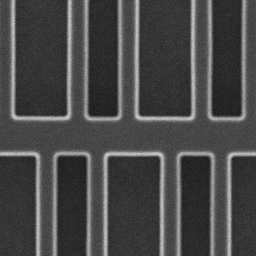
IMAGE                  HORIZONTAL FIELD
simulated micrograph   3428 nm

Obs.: groups of lines, slits or small figures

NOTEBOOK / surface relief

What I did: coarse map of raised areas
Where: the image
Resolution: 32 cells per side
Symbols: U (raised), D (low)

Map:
UUDDDDDDDUUDDDDUUDDDDDDDUUDDDDUU
UUDDDDDDDUUDDDDUUDDDDDDDUUDDDDUU
UUDDDDDDDUUDDDDUUDDDDDDDUUDDDDUU
UUDDDDDDDUUDDDDUUDDDDDDDUUDDDDUU
UUDDDDDDDUUDDDDUUDDDDDDDUUDDDDUU
UUDDDDDDDUUDDDDUUDDDDDDDUUDDDDUU
UUDDDDDDDUUDDDDUUDDDDDDDUUDDDDUU
UUDDDDDDDUUDDDDUUDDDDDDDUUDDDDUU
UUDDDDDDDUUDDDDUUDDDDDDDUUDDDDUU
UUDDDDDDDUUDDDDUUDDDDDDDUUDDDDUU
UUDDDDDDDUUDDDDUUDDDDDDDUUDDDDUU
UUDDDDDDDUUDDDDUUDDDDDDDUUDDDDUU
UUDDDDDDDUUDDDDUUDDDDDDDUUDDDDUU
UUDDDDDDDUUDDDDUUDDDDDDDUUDDDDUU
UUDDDDDDUUUDDDDUUDDDDDDDUUDDDDUU
UUUUUUUUUUUUUUUUUUUUUUUUUUUUUUUU
UUUUUUUUUUUUUUUUUUUUUUUUUUUUUUUU
UUUUUUUUUUUUUUUUUUUUUUUUUUUUUUUU
UUUUUUUUUUUUUUUUUUUUUUUUUUUUUUUU
DDDDUUUDDDDUUUDDDDDDUUUDDDUUUDDD
DDDDDUUDDDDUUDDDDDDDUUDDDDDUUDDD
DDDDDUUDDDDUUDDDDDDDUUDDDDDUUDDD
DDDDDUUDDDDUUDDDDDDDUUDDDDUUUDDD
DDDDDUUDDDDUUDDDDDDDUUDDDDUUUDDD
DDDDDUUDDDDUUDDDDDDDUUDDDDUUUDDD
DDDDDUUDDDDUUDDDDDDDUUDDDDUUUDDD
DDDDDUUDDDDUUDDDDDDDUUDDDDUUUDDD
DDDDDUUDDDDUUDDDDDDDUUDDDDUUUDDD
DDDDDUUDDDDUUDDDDDDDUUDDDDUUUDDD
DDDDDUUDDDDUUDDDDDDDUUDDDDUUUDDD
DDDDDUUDDDDUUDDDDDDDUUDDDDUUUDDD
DDDDDUUDDDDUUDDDDDDDUUDDDDUUUDDD